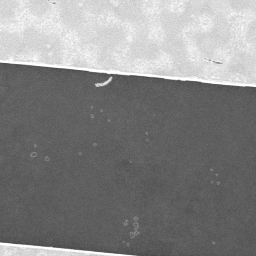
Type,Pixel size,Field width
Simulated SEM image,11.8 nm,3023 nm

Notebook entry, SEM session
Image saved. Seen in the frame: one or a few lines or trenches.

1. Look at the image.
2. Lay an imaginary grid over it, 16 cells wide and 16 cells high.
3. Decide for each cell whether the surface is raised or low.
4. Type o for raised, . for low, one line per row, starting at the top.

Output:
oooooooooooooooo
oooooooooooooooo
oooooooooooooooo
oooooooooooooooo
.......ooooooooo
................
................
................
................
................
................
................
................
................
................
ooo.............